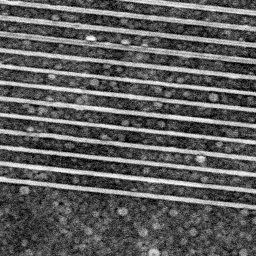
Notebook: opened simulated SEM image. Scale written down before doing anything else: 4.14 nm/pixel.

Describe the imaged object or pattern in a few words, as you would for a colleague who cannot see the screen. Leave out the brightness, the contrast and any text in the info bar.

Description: parallel lines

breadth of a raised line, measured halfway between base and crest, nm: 14.9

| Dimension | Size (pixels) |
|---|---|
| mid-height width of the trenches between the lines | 12.4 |